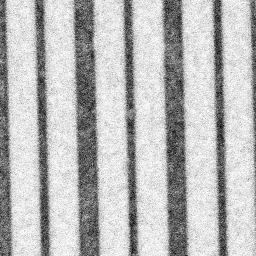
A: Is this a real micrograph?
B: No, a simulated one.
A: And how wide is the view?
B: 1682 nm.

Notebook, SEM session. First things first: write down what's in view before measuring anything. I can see parallel lines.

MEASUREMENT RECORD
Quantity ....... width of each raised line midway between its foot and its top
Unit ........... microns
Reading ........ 0.182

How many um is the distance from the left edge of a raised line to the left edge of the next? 0.283